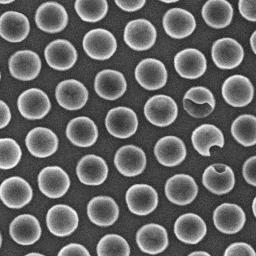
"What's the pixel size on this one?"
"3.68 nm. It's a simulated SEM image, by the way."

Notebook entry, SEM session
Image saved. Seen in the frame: a regular array of raised bodies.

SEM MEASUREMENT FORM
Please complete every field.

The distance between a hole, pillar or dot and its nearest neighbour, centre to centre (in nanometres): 143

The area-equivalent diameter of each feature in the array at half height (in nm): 114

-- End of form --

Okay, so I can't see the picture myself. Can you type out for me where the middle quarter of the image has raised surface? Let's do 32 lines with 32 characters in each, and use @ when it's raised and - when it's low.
@@-----------------@@@@@@---@@@@
------------------@@@@@@@---@@@@
---------@@@@@----@@@@@@@----@@@
--------@@@@@@@---@@@@@@@-------
@@@-----@@@@@@@----@@@@@@-------
@@@@@---@@@@@@@@----@@@@@-------
@@@@@@--@@@@@@@----------------@
@@@@@@---@@@@@@----------------@
@@@@@@----@@@---------@@@@@---@@
@@@@@----------------@@@@@@@----
@@@@@---------------@@@@@@@@----
------------@@@@@---@@@@@@@@----
-----------@@@@@@@--@@@@@@@@----
---@@@-----@@@@@@@---@@@@@@@----
--@@@@@---@@@@@@@@----@@@@@-----
-@@@@@@@---@@@@@@@--------------
-@@@@@@@---@@@@@@@--------------
-@@@@@@@----@@@@@---------------
-@@@@@@@------@----------@@@----
--@@@@@@----------------@@@@@---
----@@----------@------@@@@@@@--
--------------@@@@@----@@@@@@@--
-------------@@@@@@@---@@@@@@@--
-----@@@@----@@@@@@@---@@@@@@@--
----@@@@@@---@@@@@@@----@@@@@---
---@@@@@@@@--@@@@@@@------------
---@@@@@@@@---@@@@@@------------
@--@@@@@@@@----@@@--------------
@---@@@@@@@----------------@@@@@
@---@@@@@@----------------@@@@@@
@----------------@@@@----@@@@@@@
@---------------@@@@@@---@@@@@@@